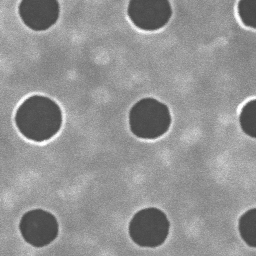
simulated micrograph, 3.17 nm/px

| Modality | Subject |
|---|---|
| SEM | holes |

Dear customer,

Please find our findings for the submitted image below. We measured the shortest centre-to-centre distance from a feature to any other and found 347 nm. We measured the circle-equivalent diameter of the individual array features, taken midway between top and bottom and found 132 nanometers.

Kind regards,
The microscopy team